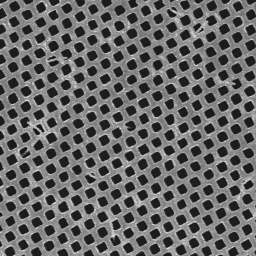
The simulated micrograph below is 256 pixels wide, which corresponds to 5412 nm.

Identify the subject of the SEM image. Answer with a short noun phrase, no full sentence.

a regular array of holes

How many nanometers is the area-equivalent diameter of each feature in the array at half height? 217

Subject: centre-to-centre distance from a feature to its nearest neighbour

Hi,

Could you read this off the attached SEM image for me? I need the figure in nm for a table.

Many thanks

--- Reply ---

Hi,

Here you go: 315